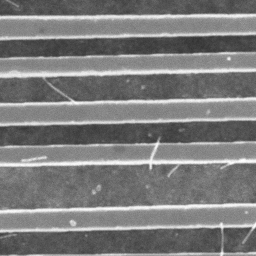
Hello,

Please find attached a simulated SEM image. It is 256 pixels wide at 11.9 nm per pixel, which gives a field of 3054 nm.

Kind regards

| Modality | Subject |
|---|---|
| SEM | lines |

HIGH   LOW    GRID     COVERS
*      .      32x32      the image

................................
................................
********************************
********************************
**********************..........
................................
................................
********************************
********************************
******..........................
................................
................................
.....................***********
********************************
********************************
***********.....................
................................
................................
********************************
********************************
*****************.*.............
................................
................................
................................
................................
................................
********************************
********************************
*******************........*....
................................
................................
................................